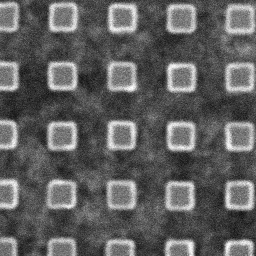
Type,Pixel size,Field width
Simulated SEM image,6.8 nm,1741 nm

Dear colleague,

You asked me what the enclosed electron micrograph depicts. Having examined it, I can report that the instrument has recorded a regular array of raised bodies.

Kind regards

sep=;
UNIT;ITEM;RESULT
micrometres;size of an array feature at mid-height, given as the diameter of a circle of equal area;0.201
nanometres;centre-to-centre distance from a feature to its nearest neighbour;399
